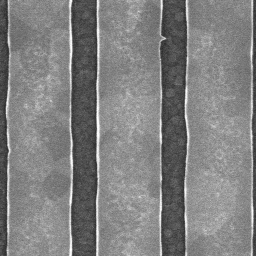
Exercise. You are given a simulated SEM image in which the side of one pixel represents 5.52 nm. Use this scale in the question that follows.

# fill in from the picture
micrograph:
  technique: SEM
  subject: one or a few lines or trenches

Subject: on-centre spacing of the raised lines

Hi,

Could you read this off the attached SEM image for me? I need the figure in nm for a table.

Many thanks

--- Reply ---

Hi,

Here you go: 496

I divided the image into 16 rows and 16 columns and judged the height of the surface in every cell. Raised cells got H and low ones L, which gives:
LHHHLLHHHHLLHHHH
LHHHLLHHHHLLHHHH
LHHHLLHHHHLLHHHH
LHHHLLHHHHLLHHHH
LHHHLLHHHHLLHHHH
LHHHLLHHHHLLHHHH
HHHHLLHHHHLLHHHH
HHHHLLHHHHLLHHHH
HHHHLLHHHHLLHHHH
LHHHLLHHHHLLHHHH
LHHHHLHHHHLLHHHH
LHHHLLHHHHLLHHHH
HHHHLLHHHHLLHHHH
LHHHLLHHHHLLHHHH
LHHHLLHHHHLLHHHH
HHHHLLHHHHLLHHHH